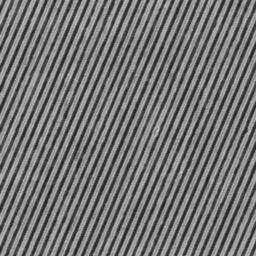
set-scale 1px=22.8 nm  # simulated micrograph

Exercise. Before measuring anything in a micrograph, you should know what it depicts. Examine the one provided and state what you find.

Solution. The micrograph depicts parallel lines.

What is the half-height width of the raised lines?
78.9 nanometres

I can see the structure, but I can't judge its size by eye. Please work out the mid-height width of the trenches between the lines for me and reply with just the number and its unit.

100 nm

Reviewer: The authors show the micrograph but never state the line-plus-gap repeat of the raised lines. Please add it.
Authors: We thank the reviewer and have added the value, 178 nm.